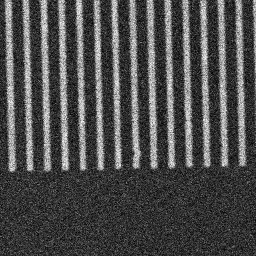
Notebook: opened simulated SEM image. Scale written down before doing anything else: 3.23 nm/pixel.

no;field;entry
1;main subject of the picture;parallel lines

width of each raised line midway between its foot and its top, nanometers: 18.9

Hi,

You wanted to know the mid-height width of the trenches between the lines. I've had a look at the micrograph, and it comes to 38.3 nm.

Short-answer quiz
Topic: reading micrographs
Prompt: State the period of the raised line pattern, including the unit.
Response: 57.1 nm